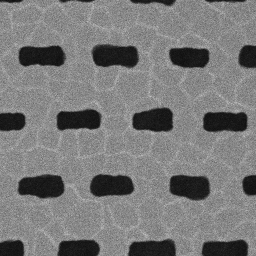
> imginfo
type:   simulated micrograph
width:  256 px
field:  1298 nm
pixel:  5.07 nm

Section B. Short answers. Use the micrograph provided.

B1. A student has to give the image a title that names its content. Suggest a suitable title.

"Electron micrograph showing a regular array of holes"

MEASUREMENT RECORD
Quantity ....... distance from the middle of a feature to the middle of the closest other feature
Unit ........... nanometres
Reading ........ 368